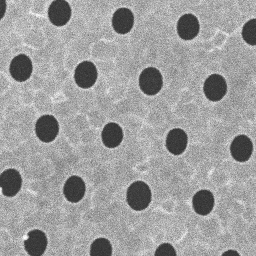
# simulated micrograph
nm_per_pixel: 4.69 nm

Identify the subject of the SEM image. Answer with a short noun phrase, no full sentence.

a regular array of holes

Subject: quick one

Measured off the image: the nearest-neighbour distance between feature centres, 64.9 pixels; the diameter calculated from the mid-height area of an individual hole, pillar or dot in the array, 0.118 um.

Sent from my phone